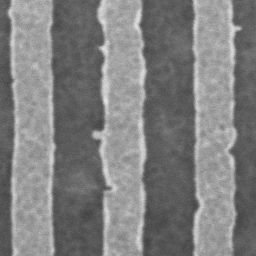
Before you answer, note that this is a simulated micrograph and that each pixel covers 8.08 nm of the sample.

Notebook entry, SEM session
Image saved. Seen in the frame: one or a few lines or trenches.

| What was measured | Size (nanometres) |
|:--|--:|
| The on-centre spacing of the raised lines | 735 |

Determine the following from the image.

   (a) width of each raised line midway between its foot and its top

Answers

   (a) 37 pixels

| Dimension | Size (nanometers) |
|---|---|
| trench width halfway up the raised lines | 440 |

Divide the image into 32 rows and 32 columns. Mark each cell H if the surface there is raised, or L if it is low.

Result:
LHHHHHHLLLLLLHHHHHLLLLLLHHHHHLLL
LHHHHHHLLLLLLHHHHLLLLLLLHHHHHLLL
LHHHHHLLLLLLLHHHHLLLLLLLLHHHHLLL
LLHHHHLLLLLLLHHHHLLLLLLLHHHHHLLL
LLHHHHLLLLLLLHHHHHLLLLLLHHHHHLLL
LLHHHHLLLLLLLHHHHHLLLLLLHHHHHLLL
LLHHHHLLLLLLLHHHHHLLLLLLHHHHHLLL
LLHHHHLLLLLLLHHHHHLLLLLLLHHHHLLL
LLHHHHLLLLLLLHHHHHLLLLLLHHHHHLLL
LLHHHHLLLLLLLHHHHHLLLLLLHHHHHLLL
LLHHHHLLLLLLLHHHHHLLLLLLLHHHHLLL
LLHHHHLLLLLLLHHHHHLLLLLLHHHHHLLL
LLHHHHLLLLLLLHHHHHLLLLLLLHHHHLLL
LLHHHHLLLLLLLHHHHHLLLLLLLHHHHLLL
LLHHHHLLLLLLLHHHHHLLLLLLLHHHHLLL
LLHHHHLLLLLLLHHHHHLLLLLLLHHHHLLL
LLHHHHHLLLLLLHHHHHLLLLLLLHHHHLLL
LLHHHHLLLLLLHHHHHHLLLLLLLHHHHLLL
LLHHHHHLLLLLLHHHHHLLLLLLLHHHHLLL
LLHHHHLLLLLLLHHHHHLLLLLLLHHHHLLL
LLHHHHLLLLLLLHHHHHLLLLLLLHHHHLLL
LLHHHHLLLLLLLHHHHHLLLLLLLHHHHLLL
LLHHHHLLLLLLLLHHHHLLLLLLLHHHHLLL
LLHHHHLLLLLLLLHHHHLLLLLLLHHHHLLL
LLHHHHLLLLLLLHHHHHLLLLLLLHHHHLLL
LLHHHHLLLLLLLHHHHHLLLLLLLHHHHLLL
LLHHHHLLLLLLLHHHHHLLLLLLLHHHHLLL
LLHHHHLLLLLLLHHHHHLLLLLLLHHHHLLL
LLHHHHLLLLLLLHHHHHLLLLLLHHHHHLLL
LLHHHHLLLLLLLHHHHLLLLLLLHHHHHLLL
LLHHHHHLLLLLLHHHHLLLLLLLHHHHHLLL
LLHHHHHLLLLLLHHHHHLLLLLLHHHHHLLL